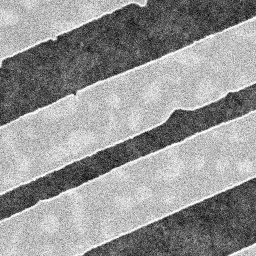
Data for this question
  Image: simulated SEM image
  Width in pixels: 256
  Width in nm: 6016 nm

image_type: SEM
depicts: one or a few lines or trenches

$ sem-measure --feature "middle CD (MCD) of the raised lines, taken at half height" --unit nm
1430